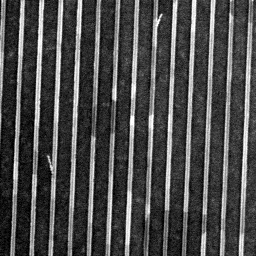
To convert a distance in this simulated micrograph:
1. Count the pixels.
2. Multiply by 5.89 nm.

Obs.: parallel lines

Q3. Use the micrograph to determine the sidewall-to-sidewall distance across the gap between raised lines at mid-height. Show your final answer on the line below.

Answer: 94.9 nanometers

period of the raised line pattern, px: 19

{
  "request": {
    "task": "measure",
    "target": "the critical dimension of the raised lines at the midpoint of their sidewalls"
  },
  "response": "16.9 nm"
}